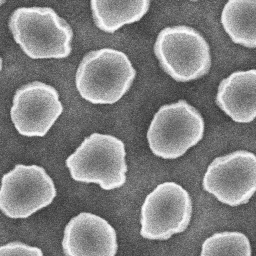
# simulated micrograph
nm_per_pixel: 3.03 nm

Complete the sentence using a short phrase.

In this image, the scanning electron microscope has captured raised bodies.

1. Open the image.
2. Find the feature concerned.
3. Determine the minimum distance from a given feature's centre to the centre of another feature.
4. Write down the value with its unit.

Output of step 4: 237 nanometers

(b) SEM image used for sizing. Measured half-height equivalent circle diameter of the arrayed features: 0.159 micrometres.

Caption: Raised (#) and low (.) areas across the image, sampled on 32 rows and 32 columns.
............######..........####
..#####.....######..........####
..#####.....#####...........####
..######.....##.............####
..#######...........#####....###
...######...........######.....#
...#####....###.....######......
...........#####....######......
..........######.....####.......
..........#######.....##.....###
..........######............####
...####...#####............#####
..#####....####............#####
..######.............###....####
.######............######....###
..#####............######.......
..####.............######.......
...........####....######.......
..........#####....#####........
.........######.....##.......###
.........#######...........#####
.####....######...........######
######....#####...........######
#######......#......###...######
#######............####....####.
######............######........
.###..............#####.........
.........####.....#####.........
........######....#####.........
........######....###......###..
........######...........######.
#####....#####...........######.